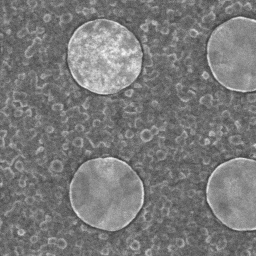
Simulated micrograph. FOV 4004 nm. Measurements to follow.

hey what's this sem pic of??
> raised bodies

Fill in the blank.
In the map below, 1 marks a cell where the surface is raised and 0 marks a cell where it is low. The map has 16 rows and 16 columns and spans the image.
0000000000000000
0000011000000011
0000111110000111
0000111110000111
0000111110000111
0000011100000011
0000000000000000
0000000000000000
0000000000000000
0000000000000000
0000011100000011
0000111110000111
0000111110000111
0000011100000011
0000000000000000
0000000000000000